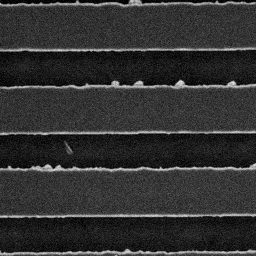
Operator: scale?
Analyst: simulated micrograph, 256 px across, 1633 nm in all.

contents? lines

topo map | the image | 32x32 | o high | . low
..ooooooooooooo.oooooooooooooooo
oooooooooooooooooooooooooooooooo
oooooooooooooooooooooooooooooooo
oooooooooooooooooooooooooooooooo
oooooooooooooooooooooooooooooooo
oooooooooooooooooooooooooooooooo
................................
................................
................................
................................
.................o....o.........
oooooooooooooooooooooooooooooooo
oooooooooooooooooooooooooooooooo
oooooooooooooooooooooooooooooooo
oooooooooooooooooooooooooooooooo
oooooooooooooooooooooooooooooooo
oooooooooooooooooooooooooooooooo
................................
................................
................................
................................
oooooooooooooooooooooooooooooooo
oooooooooooooooooooooooooooooooo
oooooooooooooooooooooooooooooooo
oooooooooooooooooooooooooooooooo
oooooooooooooooooooooooooooooooo
oooooooooooooooooooooooooooooooo
................................
................................
................................
................................
........ooooooooooooo.oooooooooo